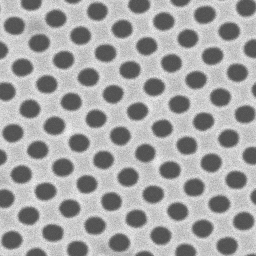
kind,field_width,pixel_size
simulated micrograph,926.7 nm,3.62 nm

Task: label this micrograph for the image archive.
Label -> a regular array of holes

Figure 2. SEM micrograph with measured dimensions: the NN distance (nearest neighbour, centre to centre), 107 nanometers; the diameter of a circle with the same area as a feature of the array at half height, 0.0723 µm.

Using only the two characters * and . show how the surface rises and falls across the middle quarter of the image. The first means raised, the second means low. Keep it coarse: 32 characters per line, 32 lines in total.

..************.....*****.....***
*****...******.....******....***
****.....*****.....************.
***......******...****.*******..
****....************.....*****..
*****..****...******.....******.
**********.....*****.....*******
...*******.....******...********
....******.....************....*
.....******...************.....*
....************.....*****.....*
*..****..*******.....******....*
******....******.....***********
*****......*****....************
*****.....*************...******
******....************.....*****
************....******.....*****
***.********.....******....*****
*.....******.....*******.****...
*......*****....************....
*.....*************...******....
**....************.....*****....
********....******.....******...
*******.....******.....*********
..*****.....********.****...****
..******....************.....***
..************....******.....***
..************.....*****.....***
****....*****......******...****
***.....******....************..
***.....*******..****..*******..
****....************.....*****..